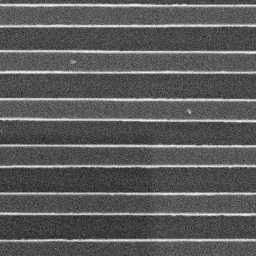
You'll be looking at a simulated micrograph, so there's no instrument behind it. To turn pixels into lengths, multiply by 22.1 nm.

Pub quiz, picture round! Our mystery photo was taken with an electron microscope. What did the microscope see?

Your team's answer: lines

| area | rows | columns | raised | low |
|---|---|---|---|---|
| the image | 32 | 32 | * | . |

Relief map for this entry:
................................
********************************
********************************
................................
................................
................................
***********************.**......
********************************
********************************
................................
................................
................................
*******************************.
********************************
********************************
................................
................................
................................
********************************
********************************
********************************
................................
................................
................................
********************************
********************************
********************************
................................
................................
................................
********************************
********************************